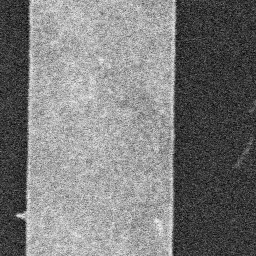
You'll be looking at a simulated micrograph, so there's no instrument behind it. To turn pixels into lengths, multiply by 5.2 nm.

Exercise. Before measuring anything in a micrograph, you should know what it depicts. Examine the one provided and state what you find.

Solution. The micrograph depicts one or a few lines or trenches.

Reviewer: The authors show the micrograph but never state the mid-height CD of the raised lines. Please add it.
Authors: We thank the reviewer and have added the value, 746 nm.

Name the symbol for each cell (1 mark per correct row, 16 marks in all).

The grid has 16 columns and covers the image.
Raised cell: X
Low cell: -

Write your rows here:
--XXXXXXXXX-----
--XXXXXXXXX-----
--XXXXXXXXX-----
--XXXXXXXXX-----
--XXXXXXXXX-----
--XXXXXXXXX-----
--XXXXXXXXX-----
--XXXXXXXXX-----
--XXXXXXXXX-----
--XXXXXXXXX-----
--XXXXXXXXX-----
--XXXXXXXXX-----
--XXXXXXXXX-----
--XXXXXXXXX-----
--XXXXXXXXX-----
--XXXXXXXXX-----